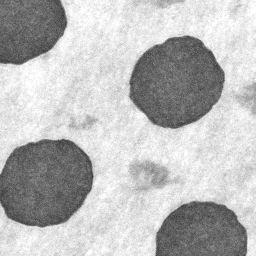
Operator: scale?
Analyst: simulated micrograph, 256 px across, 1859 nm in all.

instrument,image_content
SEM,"holes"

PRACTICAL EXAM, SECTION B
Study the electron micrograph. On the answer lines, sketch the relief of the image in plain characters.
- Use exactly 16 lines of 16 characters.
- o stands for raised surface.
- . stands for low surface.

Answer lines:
....oooooooooooo
....oooooooooooo
....oooooo..oooo
..ooooooo....ooo
oooooooo......oo
oooooooo......oo
oooooooo.....ooo
ooooooooo...oooo
oooooooooooooooo
o....ooooooooooo
......oooooooooo
......oooooooooo
.....ooooooooooo
o....oooooo....o
oooooooooo.....o
oooooooooo.....o